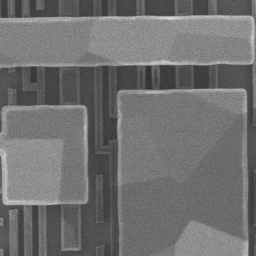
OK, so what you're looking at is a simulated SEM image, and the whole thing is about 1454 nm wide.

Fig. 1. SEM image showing wiring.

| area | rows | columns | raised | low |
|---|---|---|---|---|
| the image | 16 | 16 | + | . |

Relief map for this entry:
................
++++++++++++++++
++++++++++++++++
++++++++++++++++
................
................
.......++++++++.
+++++..++++++++.
+++++..++++++++.
+++++..++++++++.
+++++..++++++++.
+++++..++++++++.
+++++..++++++++.
.......++++++++.
.......++++++++.
.......++++++++.